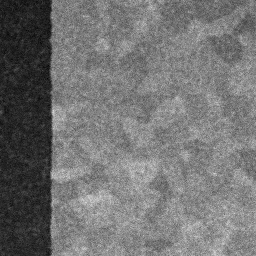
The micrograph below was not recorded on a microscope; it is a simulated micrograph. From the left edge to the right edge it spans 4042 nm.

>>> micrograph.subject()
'one or a few lines or trenches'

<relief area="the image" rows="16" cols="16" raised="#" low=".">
...#############
...#############
...#############
...#############
...#############
...#############
...#############
...#############
...#############
...#############
...#############
...#############
...#############
...#############
...#############
...#############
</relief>